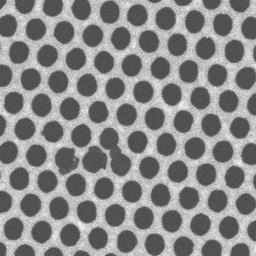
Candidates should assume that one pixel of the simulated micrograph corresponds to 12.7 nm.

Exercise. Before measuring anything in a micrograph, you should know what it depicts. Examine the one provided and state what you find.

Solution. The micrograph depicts a regular array of holes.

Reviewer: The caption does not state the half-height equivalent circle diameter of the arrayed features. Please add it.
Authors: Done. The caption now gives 271 nanometers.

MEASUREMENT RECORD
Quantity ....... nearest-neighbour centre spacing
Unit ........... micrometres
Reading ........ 0.359